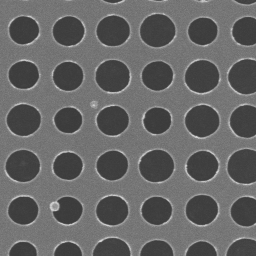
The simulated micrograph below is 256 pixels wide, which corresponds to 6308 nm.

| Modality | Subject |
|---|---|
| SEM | a regular array of holes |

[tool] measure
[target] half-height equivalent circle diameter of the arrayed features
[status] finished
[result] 31 pixels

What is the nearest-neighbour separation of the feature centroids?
1100 nm